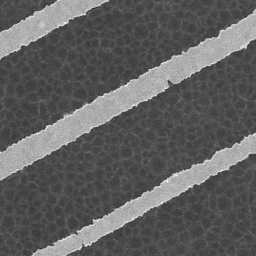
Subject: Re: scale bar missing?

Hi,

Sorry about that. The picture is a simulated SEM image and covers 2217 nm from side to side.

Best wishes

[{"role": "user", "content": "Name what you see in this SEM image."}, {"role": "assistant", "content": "one or a few lines or trenches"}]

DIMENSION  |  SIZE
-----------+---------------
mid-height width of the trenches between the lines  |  0.703 µm